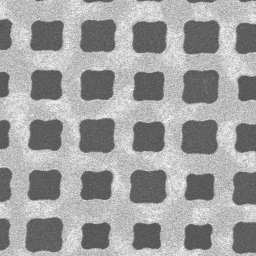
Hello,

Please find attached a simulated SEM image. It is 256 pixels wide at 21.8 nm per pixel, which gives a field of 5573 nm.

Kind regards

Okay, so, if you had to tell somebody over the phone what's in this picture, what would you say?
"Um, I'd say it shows a regular array of holes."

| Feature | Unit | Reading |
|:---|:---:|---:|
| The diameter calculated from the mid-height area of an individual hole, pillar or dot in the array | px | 34.8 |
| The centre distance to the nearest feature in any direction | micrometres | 1.08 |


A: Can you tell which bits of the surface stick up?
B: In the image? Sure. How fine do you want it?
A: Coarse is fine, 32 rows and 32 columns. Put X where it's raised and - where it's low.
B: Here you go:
XXXXXXXXXXXXXXXXXXXXXXXXXXXXXXXX
XXXXXXXXXXXXXXXXXXXXXXXXXXXXXXXX
-XXXXXXXXXX-X-XXXXXXXXXXXXXXXXXX
-XXX----XX----XXX----XX----XXX--
-XXX----XX----XXX----XX----XXX--
-XXX----XX----XXX----XX----XX---
XXXXXXXXXXX-X-XXX---XXX----XXX--
XXXXXXXXXXXXXXXXXXXXXXXXXXXXXXXX
XXXXXXXXXXXXXXXXXXXXXXXXXXXXXXXX
-XXX----XX----XXX----XX----XXX--
-XXX----XX----XXX----XX----XXX--
-XXX----XX----XXX----XX----XXX--
XXXX-XXXXX--XXXXX---XXX----XXX--
XXXXXXXXXXXXXXXXXXXXXXXXXXXXXXXX
XXXXXXXXXXXXXXXXXXXXXXXXXXXXXXXX
-XXX----XX----XXX---XXX----XXX--
-XXX----XX----XXX----XX----XX---
-XXX----XX----XXX----XX----XX---
-XXX---XXX----XXX---XXX----XX---
XXXXXXXXXXXXXXXXXXXXXXXXXXXXXXXX
XXXXXXXXXXXXXXXXXXXXXXXXXXXXXXXX
-XXX---XXXX---XXX----XXXXXXXXX-X
-XXX----XX----XX-----XX----XX---
-XXX----XX----XX-----XX----XX---
-XXX---XXX----XX-----XX----XX---
XXXXXXXXXXXXXXXXXXXXXXXXXXXXX---
XXXXXXXXXXXXXXXXXXXXXXXXXXXXXXXX
-XXX----XXXXXXXXXXXXXXXXXXXXXXXX
-XX-----XX----XXX---XXX----XX---
-XX-----XX----XXX---XXX---XXX---
-XX-----XX----XXX---XXX----XX---
XXXXXXXXXXXXXXXXXXXXXXXXXXXXX---